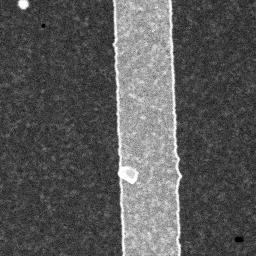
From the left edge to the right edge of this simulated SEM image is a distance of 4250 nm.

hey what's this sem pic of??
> one or a few lines or trenches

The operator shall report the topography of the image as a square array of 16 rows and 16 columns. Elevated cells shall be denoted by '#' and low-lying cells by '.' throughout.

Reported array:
.......####.....
.......####.....
.......####.....
.......####.....
.......####.....
.......####.....
.......####.....
.......####.....
.......####.....
.......####.....
.......####.....
........###.....
........###.....
........###.....
........###.....
........###.....